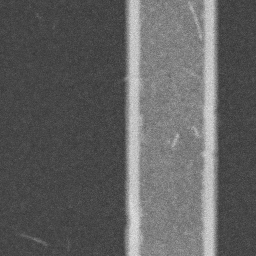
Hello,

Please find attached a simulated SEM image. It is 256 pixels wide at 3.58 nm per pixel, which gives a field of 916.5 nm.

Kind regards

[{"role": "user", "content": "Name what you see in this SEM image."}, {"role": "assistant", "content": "one or a few lines or trenches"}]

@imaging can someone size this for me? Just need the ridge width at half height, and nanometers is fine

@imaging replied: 268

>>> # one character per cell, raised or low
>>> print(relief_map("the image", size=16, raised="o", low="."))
........ooooo...
........ooooo...
........ooooo...
........ooooo...
........ooooo...
........ooooo...
........ooooo...
........ooooo...
........ooooo...
........ooooo...
........ooooo...
........ooooo...
........ooooo...
........ooooo...
........ooooo...
........ooooo...